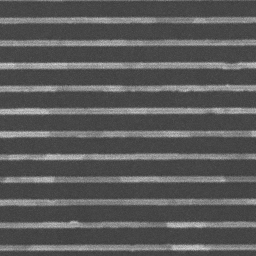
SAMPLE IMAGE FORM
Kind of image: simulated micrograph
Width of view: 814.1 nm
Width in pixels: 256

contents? parallel lines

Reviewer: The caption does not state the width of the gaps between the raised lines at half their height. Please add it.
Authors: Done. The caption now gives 58.9 nm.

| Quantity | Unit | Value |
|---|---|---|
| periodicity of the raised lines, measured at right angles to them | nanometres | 72.2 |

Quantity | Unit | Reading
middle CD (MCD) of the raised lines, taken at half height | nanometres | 12.3